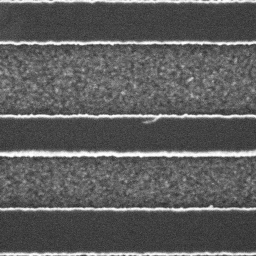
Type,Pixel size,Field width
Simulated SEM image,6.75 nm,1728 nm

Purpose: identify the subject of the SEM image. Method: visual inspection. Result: lines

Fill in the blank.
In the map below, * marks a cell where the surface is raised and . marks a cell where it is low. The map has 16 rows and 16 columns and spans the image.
****************
****************
****************
................
................
................
................
****************
****************
****************
................
................
................
****************
****************
****************